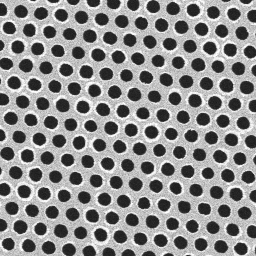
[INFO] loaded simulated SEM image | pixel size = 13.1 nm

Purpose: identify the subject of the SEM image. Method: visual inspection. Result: a regular array of holes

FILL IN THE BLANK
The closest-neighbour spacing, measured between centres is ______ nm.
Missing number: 262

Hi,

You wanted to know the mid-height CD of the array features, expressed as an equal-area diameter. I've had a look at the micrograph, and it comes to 0.171 um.